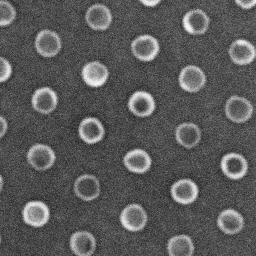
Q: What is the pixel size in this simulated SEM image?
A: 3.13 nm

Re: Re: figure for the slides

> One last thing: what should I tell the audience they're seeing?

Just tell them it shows a regular array of raised bodies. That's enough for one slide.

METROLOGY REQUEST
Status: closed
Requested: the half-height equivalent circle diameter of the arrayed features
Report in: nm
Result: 75.1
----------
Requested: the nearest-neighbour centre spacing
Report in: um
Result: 0.174